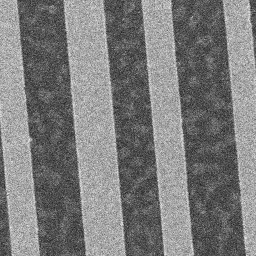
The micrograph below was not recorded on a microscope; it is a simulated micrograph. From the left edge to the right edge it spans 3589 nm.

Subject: one or a few lines or trenches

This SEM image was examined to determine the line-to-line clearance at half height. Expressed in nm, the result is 658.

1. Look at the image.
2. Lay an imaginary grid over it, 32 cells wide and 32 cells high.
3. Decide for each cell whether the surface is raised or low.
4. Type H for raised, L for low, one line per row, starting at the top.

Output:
HHLLLLLLHHHHHLLLLLHHHLLLLLLLHHHL
HHLLLLLLHHHHHLLLLLHHHLLLLLLLHHHL
HHLLLLLLHHHHHLLLLLHHHLLLHLLLHHHL
HHLLLLLLHHHHHLLLLLHHHHLLLLLLHHHL
HHLLLLLLHHHHHLLLLLHHHHLLLLLLHHHL
HHLLLLLLHHHHHLLLLLHHHHLLLLLLHHHH
HHHLLLLLLHHHHLLLLLHHHHLLLLLLLHHH
HHHLLLLLLHHHHLLLLLHHHHLLLLLLLHHH
HHHLLLLLLHHHHHLLLLLHHHLLLLLLLHHH
HHHLLLLLLHHHHHLLLLLHHHLLLLLLLHHH
HHHLLLLLLHHHHHLLLLLHHHLLLLLLLHHH
HHHLLLLLLHHHHHLLLLLHHHLLLLLLLHHH
HHHLLLLLLHHHHHLLLLLHHHLLLLLLLHHH
HHHLLLLLLHHHHHLLLLLHHHLLLLLLLHHH
HHHLLLLLLHHHHHLLLLLHHHHLLLLLLHHH
HHHLLLLLLHHHHHLLLLLHHHHLLLLLLHHH
HHHLLLLLLHHHHHLLLLLHHHHLLLLLLHHH
HHHHLLLLLLHHHHLLLLLHHHHLLLLLLLHH
HHHHLLLLLLHHHHLLLLLHHHHLLLLLLLHH
LHHHLLLLLLHHHHHLLLLLHHHLLLLLLLHH
LHHHLLLLLLHHHHHLLLLLHHHLLLLLLLHH
LHHHLLLLLLHHHHHLLLLLHHHLLLLLLLHH
LHHHLLLLLLHHHHHLLLLLHHHLLLLLLLHH
LHHHLLLLLLHHHHHLLLLLHHHLLLLLLLHH
LHHHLLLLLLHHHHHLLLLLHHHLLLLLLLHH
LHHHLLLLLLHHHHHLLLLLHHHHLLLLLLHH
LHHHLLLLLLHHHHHLLLLLHHHHLLLLLLHH
LHHHHLLLLLHHHHHLLLLLHHHHLLLLLLHH
LHHHHLLLLLLHHHHLLLLLHHHHLLLLLLLH
LHHHHLLLLLLHHHHLLLLLHHHHLLLLLLLH
LHHHHLLLLLLHHHHHLLLLLHHHLLLLLLLH
LLHHHLLLLLLHHHHHLLLLLHHHLLLLLLLH